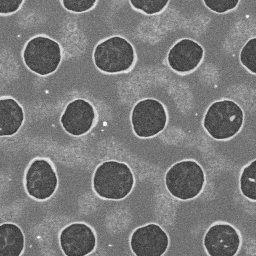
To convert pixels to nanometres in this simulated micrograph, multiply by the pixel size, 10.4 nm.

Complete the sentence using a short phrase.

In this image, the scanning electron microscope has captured a regular array of holes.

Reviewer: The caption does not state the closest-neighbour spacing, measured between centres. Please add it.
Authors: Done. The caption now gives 71.2 pixels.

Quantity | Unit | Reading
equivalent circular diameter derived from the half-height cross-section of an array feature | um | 0.388